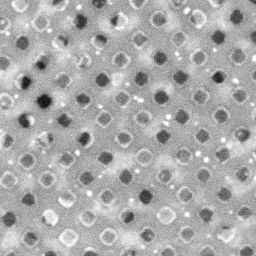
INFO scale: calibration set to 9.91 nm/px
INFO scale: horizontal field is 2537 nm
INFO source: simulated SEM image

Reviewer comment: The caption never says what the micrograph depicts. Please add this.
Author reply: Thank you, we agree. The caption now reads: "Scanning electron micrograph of a regular array of raised bodies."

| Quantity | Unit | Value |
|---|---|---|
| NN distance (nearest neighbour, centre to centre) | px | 27.3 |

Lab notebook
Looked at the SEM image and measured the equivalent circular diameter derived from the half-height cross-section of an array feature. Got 0.159 microns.